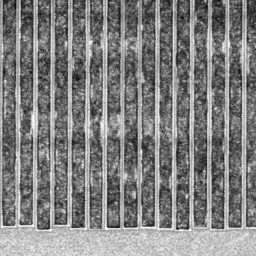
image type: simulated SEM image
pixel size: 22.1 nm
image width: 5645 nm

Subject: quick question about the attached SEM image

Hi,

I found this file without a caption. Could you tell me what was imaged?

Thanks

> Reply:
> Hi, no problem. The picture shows parallel lines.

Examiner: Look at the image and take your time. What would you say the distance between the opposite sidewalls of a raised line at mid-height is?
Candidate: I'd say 74.4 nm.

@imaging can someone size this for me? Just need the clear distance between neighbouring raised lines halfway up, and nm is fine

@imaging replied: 322